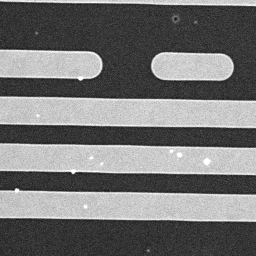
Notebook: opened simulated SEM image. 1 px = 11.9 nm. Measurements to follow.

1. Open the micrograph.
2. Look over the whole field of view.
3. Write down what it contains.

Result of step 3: groups of lines, slits or small figures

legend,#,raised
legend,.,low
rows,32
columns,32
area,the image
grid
....................############
................................
................................
................................
................................
................................
#########.......................
#############......##########...
#############......##########...
############........#########...
................................
................................
######################..........
################################
################################
.....###########################
................................
................................
############################....
################################
################################
............####################
................................
................................
################################
################################
################################
......................##########
................................
................................
................................
................................